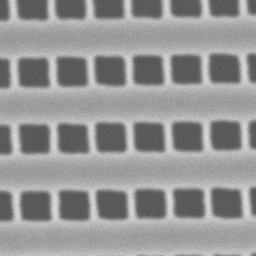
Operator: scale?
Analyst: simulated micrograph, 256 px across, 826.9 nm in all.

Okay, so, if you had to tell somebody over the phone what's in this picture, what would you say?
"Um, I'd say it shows a regular array of holes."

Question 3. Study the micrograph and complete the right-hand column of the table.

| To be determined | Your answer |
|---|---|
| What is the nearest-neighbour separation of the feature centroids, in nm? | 123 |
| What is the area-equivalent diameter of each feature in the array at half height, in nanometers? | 111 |